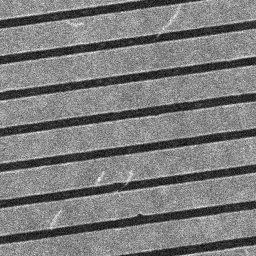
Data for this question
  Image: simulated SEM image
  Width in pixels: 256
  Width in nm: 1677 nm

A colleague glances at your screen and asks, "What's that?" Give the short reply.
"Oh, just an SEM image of parallel lines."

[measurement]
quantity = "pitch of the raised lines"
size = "234 nm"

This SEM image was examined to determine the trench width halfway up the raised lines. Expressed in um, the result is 0.0633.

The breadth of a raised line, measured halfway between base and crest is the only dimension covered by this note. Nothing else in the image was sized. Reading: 172 nm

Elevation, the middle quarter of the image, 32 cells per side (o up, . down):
ooooooooooooooooooooooooooooo...
oooooooooooooooooooooo..........
ooooooooooooooo.................
oooooooo.................ooooooo
o..................ooooooooooooo
...........ooooooooooooooooooooo
....oooooooooooooooooooooooooooo
oooooooooooooooooooooooooooooooo
oooooooooooooooooooooooooooooooo
oooooooooooooooooooooooooooo....
ooooooooooooooooooooooo.........
ooooooooooooooo.................
ooooooo..................ooooooo
o..................ooooooooooooo
............oooooooooooooooooooo
.....ooooooooooooooooooooooooooo
oooooooooooooooooooooooooooooooo
oooooooooooooooooooooooooooooooo
oooooooooooooooooooooooooooo....
oooooooooooooooooooooo..........
oooooooooooooo..................
ooooooo..................ooooooo
..................oooooooooooooo
...........ooooooooooooooooooooo
....oooooooooooooooooooooooooooo
oooooooooooooooooooooooooooooooo
oooooooooooooooooooooooooooooooo
ooooooooooooooooooooooooooooo...
ooooooooooooooooooooooo.........
ooooooooooooo..o................
ooooooo...................oooooo
...................ooooooooooooo